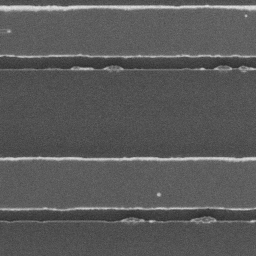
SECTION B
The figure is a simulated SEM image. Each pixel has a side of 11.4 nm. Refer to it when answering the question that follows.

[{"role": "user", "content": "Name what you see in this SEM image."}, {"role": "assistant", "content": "lines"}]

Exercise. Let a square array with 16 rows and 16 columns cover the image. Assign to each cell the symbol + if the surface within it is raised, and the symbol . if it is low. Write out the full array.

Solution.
++++++++++++++++
++++++++++++++++
++++++++++++++++
++++++++++++++++
................
................
................
................
................
................
++++++++++++++++
++++++++++++++++
++++++++++++++++
................
................
................